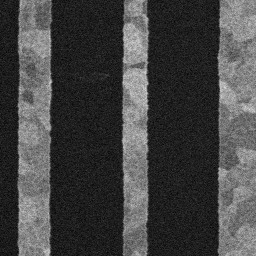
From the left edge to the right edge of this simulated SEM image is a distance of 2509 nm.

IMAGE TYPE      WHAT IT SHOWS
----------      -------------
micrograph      one or a few lines or trenches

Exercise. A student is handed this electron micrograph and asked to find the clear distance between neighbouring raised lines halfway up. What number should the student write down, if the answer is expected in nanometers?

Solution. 717